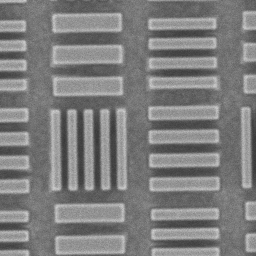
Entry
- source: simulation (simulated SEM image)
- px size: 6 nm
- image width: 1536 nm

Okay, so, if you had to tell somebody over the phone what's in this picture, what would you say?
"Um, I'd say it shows groups of lines, slits or small figures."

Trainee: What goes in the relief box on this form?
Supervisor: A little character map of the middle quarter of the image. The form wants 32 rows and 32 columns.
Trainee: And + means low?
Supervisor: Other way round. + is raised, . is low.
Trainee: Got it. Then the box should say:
.....................+++++++++++
................................
................................
.........+++++................++
++++++++++++++........++++++++++
++++++++++++++........++++++++++
++++++++++++++..................
++++++++++++++..................
................................
................................
................................
.........++..++......+++++++++++
.++..++..++..++......+++++++++++
.++..++..++..++......+++++++++++
.++..++..++..++.................
.++..++..++..++.................
.++..++..++..++.................
.++..++..++..++......+++++++++++
.++..++..++..++......+++++++++++
.++..++..++..++......+++++++++++
.++..++..++..++.................
.++..++..++..++.................
.++..++..++..++...........++++++
.++..++..++..++......+++++++++++
.++..++..++..++.......++++++++++
.++..++..++..+++......++++++++++
.++..++..++..+++................
.++..++..++..+++................
.++..++..++..+++......++++++++++
.++..++..++..+++......++++++++++
.++..++..++..+++......++++++++++
......................+++++.....